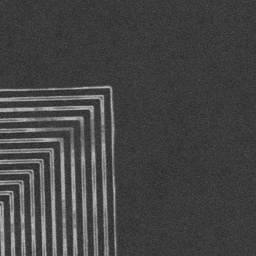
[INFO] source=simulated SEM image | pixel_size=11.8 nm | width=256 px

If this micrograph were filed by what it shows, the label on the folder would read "groups of lines, slits or small figures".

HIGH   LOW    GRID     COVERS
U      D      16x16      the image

UUUUUUUUUUUUUUUU
UUUUUUUUUUUUUUUU
UUUUUUUUUUUUUUUU
UUUUUUUUUUUUUUUU
UUUUUUUUUUUUUUUU
UUUUUUUUUUUUUUUU
DDDDDDDUUUUUUUUU
DDDDDDDUUUUUUUUU
DDDDDDDUUUUUUUUU
DDDDDDDUUUUUUUUU
DDDDDDDUUUUUUUUU
DDDDDDDUUUUUUUUU
DDDDDDDUUUUUUUUU
DDDDDDDUUUUUUUUU
DDDDDDDUUUUUUUUU
DDDDDDDUUUUUUUUU